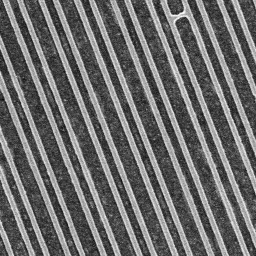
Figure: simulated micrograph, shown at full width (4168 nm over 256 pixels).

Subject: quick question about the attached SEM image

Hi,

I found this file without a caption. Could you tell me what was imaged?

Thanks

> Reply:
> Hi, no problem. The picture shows parallel lines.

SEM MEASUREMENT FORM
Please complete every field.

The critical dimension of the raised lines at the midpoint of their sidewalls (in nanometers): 79.8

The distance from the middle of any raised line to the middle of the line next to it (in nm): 271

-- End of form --